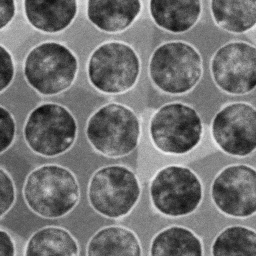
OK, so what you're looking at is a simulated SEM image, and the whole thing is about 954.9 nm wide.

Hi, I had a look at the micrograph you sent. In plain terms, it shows a regular array of holes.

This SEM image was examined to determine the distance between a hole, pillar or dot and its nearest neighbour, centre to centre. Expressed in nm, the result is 230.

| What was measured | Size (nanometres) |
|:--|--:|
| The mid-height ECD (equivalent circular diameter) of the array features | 196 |